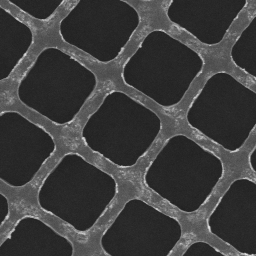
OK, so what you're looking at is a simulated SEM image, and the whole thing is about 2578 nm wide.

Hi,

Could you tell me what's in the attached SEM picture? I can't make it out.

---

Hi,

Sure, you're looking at holes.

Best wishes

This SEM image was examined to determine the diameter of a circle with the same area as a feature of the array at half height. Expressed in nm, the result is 703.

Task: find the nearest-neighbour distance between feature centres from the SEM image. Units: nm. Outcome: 771